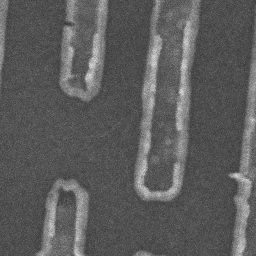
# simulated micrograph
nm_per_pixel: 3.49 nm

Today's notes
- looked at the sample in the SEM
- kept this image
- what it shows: one or a few lines or trenches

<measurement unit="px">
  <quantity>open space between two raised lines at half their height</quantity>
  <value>62.8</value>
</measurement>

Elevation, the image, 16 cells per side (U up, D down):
DDDDUUDDDDUUDDDD
DDDDUUDDDDUUDDDD
DDDDUUDDDUUUDDDD
DDDDUUDDDUUUDDDD
DDDDUUDDDUUUDDDD
DDDDUUDDDUUUDDDD
DDDDDDDDDUUUDDDD
DDDDDDDDDUUUDDDD
DDDDDDDDDUUDDDDU
DDDDDDDDDUUDDDDU
DDDDDDDDDUUDDDDU
DDDDUDDDDUUDDDDU
DDDUUDDDDDDDDDDU
DDDUUDDDDDDDDDDU
DDDUUDDDDDDDDDDU
DDDUUDDDDDDDDDDU